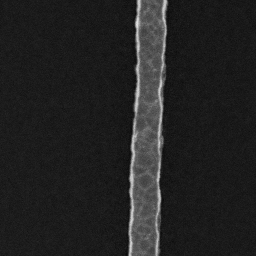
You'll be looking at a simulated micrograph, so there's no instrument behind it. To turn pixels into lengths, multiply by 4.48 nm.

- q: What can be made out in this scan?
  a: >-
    one or a few lines or trenches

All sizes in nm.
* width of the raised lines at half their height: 115